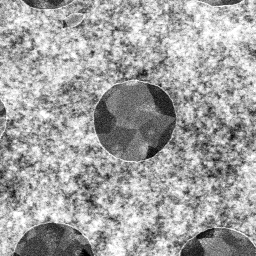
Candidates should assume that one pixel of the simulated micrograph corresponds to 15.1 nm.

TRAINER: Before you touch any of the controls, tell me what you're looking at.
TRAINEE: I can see raised bodies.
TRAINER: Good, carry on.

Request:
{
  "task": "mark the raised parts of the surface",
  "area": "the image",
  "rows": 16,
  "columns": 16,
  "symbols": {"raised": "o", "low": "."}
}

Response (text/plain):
..oo............
....o...........
................
................
................
.......ooo......
......ooooo.....
......ooooo.....
......ooooo.....
.......ooo......
................
................
................
................
..ooo........oo.
.ooooo.....ooooo